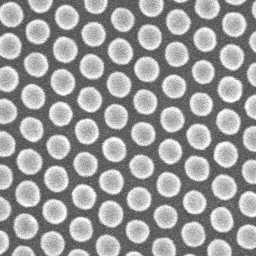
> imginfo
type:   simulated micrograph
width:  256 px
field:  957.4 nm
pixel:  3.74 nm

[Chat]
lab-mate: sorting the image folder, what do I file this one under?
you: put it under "a regular array of raised bodies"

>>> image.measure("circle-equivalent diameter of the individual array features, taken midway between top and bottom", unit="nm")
86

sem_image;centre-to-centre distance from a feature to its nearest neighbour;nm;119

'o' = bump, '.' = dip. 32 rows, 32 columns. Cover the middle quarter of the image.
....oooooo........ooooo.....o...
....oooooo........oooooo........
oo...oooo...ooo...ooooo.........
oo.........ooooo...oooo...ooo...
oo.........ooooo.........ooooo..
oo.........ooooo.........ooooo..
oo...ooo...ooooo.........ooooo..
o...ooooo...oooo..oooo....ooo...
....ooooo.........ooooo.........
....ooooo.........ooooo.........
o...ooooo...oo....ooooo.........
oo...ooo...oooo....ooo...oooo...
oo........oooooo.........oooo...
oo........oooooo........oooooo..
o...ooo....oooo.........oooooo..
...ooooo....ooo...oooo...oooo...
...ooooo.........ooooo...ooo...o
...ooooo.........oooooo........o
....oooo.........ooooo.........o
o...ooo...oooo....oooo...ooo...o
o.........ooooo.........ooooo...
o.........ooooo.........ooooo...
o...oo....ooooo.........ooooo...
...ooooo...oooo...ooo...ooooo...
...ooooo.........ooooo...ooo...o
...ooooo.........ooooo........oo
...ooooo.........ooooo........oo
....ooo...oooo...ooooo...oo....o
o........ooooo..........oooo....
o........ooooo.........oooooo...
o...o....ooooo.........oooooo...
...oooo...oooo...ooo....ooooo...